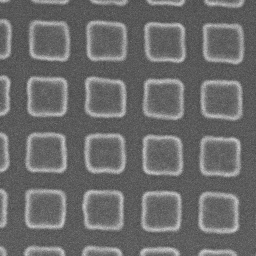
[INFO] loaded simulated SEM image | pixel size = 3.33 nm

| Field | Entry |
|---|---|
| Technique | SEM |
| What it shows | a regular array of raised bodies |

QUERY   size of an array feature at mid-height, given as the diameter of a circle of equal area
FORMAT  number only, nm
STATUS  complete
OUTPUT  140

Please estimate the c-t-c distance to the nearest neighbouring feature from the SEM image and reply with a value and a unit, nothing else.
187 nm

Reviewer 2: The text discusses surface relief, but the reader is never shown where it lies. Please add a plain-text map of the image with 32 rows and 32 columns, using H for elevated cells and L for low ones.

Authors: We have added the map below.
LLLLLLLLLLLLLLLLLLLLLHHLLLHHHHLL
LLLLLLLLLLLLLLLLLLLLLLLLLLLLLLLL
LLLLLLLLLLLLLLLLLLLLLLLLLLLLLLLL
HLLLHHHHLLLHHHHLLLHHHHHLLLHHHHLL
HLLLHHHHLLLHHHHHLLHHHHHLLLHHHHLL
HLLLHHHHHLLHHHHHLLHHHHHLLLHHHHLL
HLLLHHHHHLLHHHHHLLHHHHHLLLHHHHLL
LLLLLLLHLLLLLLLLLLLHHHHLLLHHHHLL
LLLLLLLLLLLLLLLLLLLLLLLLLLLLLLLL
LLLLLLLLLLLLLLLLLLLLLLLLLLLLLLLL
HLLLHHHHLLLHHHHLLLHHHHHLLLHHHHLL
HLLLHHHHLLLHHHHHLLHHHHHLLHHHHHLL
HLLLHHHHLLLHHHHHLLHHHHHLLHHHHHLL
HLLLHHHHLLLHHHHHLLHHHHHLLHHHHHLL
LLLLLLLLLLLLLHLLLLLHHHLLLLHHHHLL
LLLLLLLLLLLLLLLLLLLLLLLLLLLLLLLL
LLLLLLLLLLLLLLLLLLLLLLLLLLLLLLLL
HLLLHHHHLLLHHHHLLLHHHHLLLLHHHHLL
HLLLHHHHLLLHHHHLLLHHHHHLLHHHHHLL
HLLHHHHHLLLHHHHHLLHHHHHLLHHHHHLL
HLLHHHHHLLLHHHHLLLHHHHHLLHHHHHLL
LLLLLLLLLLLLLLHLLLHHHHLLLHHHHHLL
LLLLLLLLLLLLLLLLLLLLLLLLLLLLLLLL
LLLLLLLLLLLLLLLLLLLLLLLLLLLLLLLL
HLLHHHHHLLLHHHHLLLHHHHLLLHHHHLLL
HLLHHHHHLLLHHHHLLLHHHHHLLHHHHHLL
HLLHHHHHLLLHHHHLLLHHHHLLLHHHHHLL
HLLHHHHHLLLHHHHLLLHHHHLLLHHHHHLL
LLLLLLLLLLLLHHHLLLHHHHLLLHHHHHLL
LLLLLLLLLLLLLLLLLLLLLLLLLLLLLLLL
LLLLLLLLLLLLLLLLLLLLLLLLLLLLLLLL
HLLHHHHHLLLHHHHLLLHHHHLLLHHHHLLL